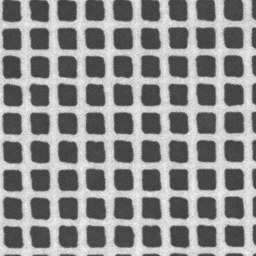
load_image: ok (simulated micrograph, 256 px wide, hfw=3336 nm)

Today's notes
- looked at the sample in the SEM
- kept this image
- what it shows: a regular array of holes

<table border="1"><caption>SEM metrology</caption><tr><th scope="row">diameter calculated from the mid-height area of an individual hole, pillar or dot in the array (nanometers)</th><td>299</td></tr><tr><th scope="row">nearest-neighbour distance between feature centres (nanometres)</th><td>360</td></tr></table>